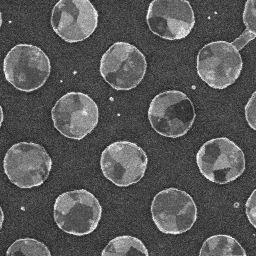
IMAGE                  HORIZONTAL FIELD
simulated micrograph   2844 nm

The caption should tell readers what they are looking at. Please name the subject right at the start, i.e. a regular array of raised bodies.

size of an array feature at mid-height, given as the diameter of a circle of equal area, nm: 508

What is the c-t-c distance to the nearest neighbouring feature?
755 nanometers